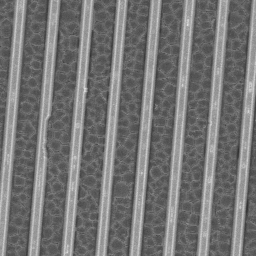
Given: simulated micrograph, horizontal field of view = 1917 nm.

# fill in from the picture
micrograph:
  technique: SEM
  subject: parallel lines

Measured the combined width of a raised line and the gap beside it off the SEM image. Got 252 nm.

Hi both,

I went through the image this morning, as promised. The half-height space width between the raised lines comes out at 188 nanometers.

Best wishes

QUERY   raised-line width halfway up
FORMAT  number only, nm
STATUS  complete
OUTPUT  62.5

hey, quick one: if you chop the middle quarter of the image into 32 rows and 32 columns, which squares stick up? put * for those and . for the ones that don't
....**......**.......**......**.
....**......**.......**......**.
....**......**.......*.......**.
...***......**......**.......**.
...***......**......**.......**.
...**.......**......**.......**.
...***......**......**.......**.
...**.......**......**.......**.
...**......***......**......***.
...**......**.......**......**..
...**......**.......**......**..
...**......**.......**......**..
...**......**.......**......**..
...**......**.......**......**..
...**......**.......*.......**..
..***......**......**.......**..
..***......**......**.......**..
..**.......**......**.......**..
..**.......**......**.......**..
..**.......**......**.......**..
..**.......**......**......***..
..**.......*.......**......**...
..**......**.......**......**...
..**......**.......**......**...
..**......**.......**......**...
..**......**.......**......**...
..**......**.......*.......**...
.***......**......**.......**...
.***......**......**.......**...
.**.......**......**.......**...
.**.......**......**.......**...
.**.......**......**.......**...